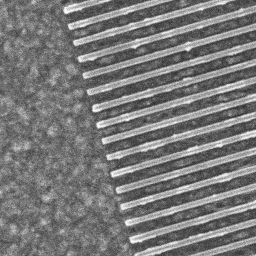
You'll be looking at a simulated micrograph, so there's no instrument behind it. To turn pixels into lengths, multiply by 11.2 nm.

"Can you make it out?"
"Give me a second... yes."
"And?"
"parallel lines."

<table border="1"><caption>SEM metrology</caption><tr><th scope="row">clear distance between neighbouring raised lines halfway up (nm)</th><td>131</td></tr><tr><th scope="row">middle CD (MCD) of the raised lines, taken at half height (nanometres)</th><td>55.2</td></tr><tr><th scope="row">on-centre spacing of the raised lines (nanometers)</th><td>191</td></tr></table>